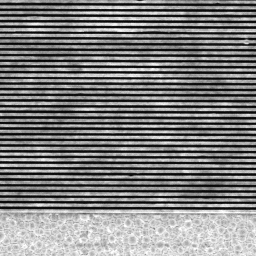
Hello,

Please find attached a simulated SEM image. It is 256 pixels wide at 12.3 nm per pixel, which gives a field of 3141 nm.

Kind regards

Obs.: parallel lines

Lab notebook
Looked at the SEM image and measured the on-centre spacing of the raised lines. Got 0.0694 micrometres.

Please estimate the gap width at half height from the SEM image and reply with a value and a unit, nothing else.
23 nm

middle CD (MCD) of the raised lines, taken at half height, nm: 44.5